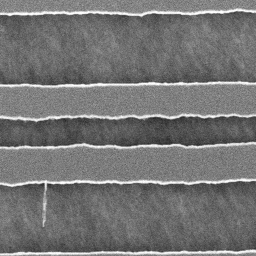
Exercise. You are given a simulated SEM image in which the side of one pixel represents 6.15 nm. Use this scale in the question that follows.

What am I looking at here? lines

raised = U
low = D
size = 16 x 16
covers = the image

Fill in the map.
UUUUUUUUUUUUUUUU
DDDDDDDDDDDDDDDD
DDDDDDDDDDDDDDDD
DDDDDDDDDDDDDDDD
DDDDDDDDDDDDDDDD
UUUUUUUUUUUUUUUU
UUUUUUUUUUUUUUUU
DDUDDDDDDDDDDDDD
DDDDDDDDDDDDDDDD
UUUUUUUUUUUUUUUU
UUUUUUUUUUUUUUUU
UUDDDDDDDDDDDDDD
DDDDDDDDDDDDDDDD
DDDDDDDDDDDDDDDD
DDDDDDDDDDDDDDDD
DDDDDDDDDDDDDDDD